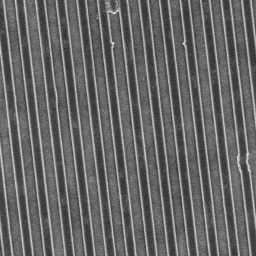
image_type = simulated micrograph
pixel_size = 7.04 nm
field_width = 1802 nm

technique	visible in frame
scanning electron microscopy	parallel lines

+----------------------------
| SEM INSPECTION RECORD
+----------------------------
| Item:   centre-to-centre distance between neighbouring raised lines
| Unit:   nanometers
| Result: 144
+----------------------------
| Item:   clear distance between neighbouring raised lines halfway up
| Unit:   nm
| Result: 79.6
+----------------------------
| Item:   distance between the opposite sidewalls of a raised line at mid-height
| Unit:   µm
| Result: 0.0664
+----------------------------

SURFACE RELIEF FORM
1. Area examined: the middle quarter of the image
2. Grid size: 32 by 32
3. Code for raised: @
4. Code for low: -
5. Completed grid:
@@---@@---@@@---@@---@@---@@---@
@@---@@---@@@---@@---@@---@@---@
@@@--@@@---@@---@@---@@---@@---@
@@@--@@@---@@---@@---@@---@@---@
-@@---@@---@@---@@---@@---@@@--@
-@@---@@---@@---@@---@@---@@@--@
-@@---@@---@@---@@---@@----@@---
-@@---@@---@@---@@@--@@@---@@---
-@@---@@---@@---@@@---@@---@@---
-@@---@@---@@@---@@---@@---@@---
-@@---@@---@@@---@@---@@---@@---
-@@@--@@@---@@---@@---@@---@@---
-@@@--@@@---@@---@@---@@---@@---
--@@---@@---@@---@@---@@---@@@--
--@@---@@---@@---@@---@@---@@@--
--@@---@@---@@---@@@--@@@---@@--
--@@---@@---@@---@@@--@@@---@@--
--@@---@@---@@@---@@---@@---@@--
--@@---@@---@@@---@@---@@---@@--
--@@---@@----@@---@@---@@---@@--
--@@@--@@@---@@---@@---@@---@@--
--@@@--@@@---@@---@@---@@---@@--
---@@---@@---@@---@@---@@---@@@-
---@@---@@---@@---@@---@@---@@@-
---@@---@@---@@---@@@--@@@---@@-
---@@---@@---@@---@@@--@@@---@@-
---@@---@@---@@@---@@---@@---@@-
---@@---@@---@@@---@@---@@---@@-
---@@@--@@@---@@---@@---@@---@@-
---@@@--@@@---@@---@@---@@---@@-
----@@---@@---@@---@@---@@---@@@
@---@@---@@---@@---@@---@@---@@@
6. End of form